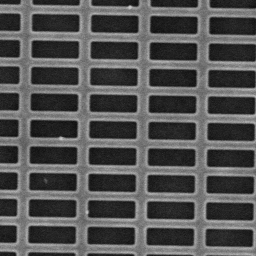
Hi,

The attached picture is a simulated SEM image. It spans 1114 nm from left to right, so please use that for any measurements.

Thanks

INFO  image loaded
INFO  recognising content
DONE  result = groups of lines, slits or small figures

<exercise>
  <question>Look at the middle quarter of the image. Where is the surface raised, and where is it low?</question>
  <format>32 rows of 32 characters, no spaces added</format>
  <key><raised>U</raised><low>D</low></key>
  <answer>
UUUUUUUUUUUUUUUUUUUUUUUUUUUUUUUU
DDDDUUDDDDDDDDDDDDUUUDDDDDDDDDDD
DDDDUUDDDDDDDDDDDDDUUDDDDDDDDDDD
DDDDUUDDDDDDDDDDDDDUUDDDDDDDDDDD
DDDDUUDDDDDDDDDDDDDUUDDDDDDDDDDD
UUDUUUUDDDDDDDDDDDUUUDDDDDDDDDDD
UUUUUUUUUUUUUUUUUUUUUUUUUUUUUUUU
DDDUUUUDDDDDDDDDDUUUUUUUUUUUUUUU
DDDDUUDDDDDDDDDDDDUUUDDDDDDDDDDD
DDDDUUDDDDDDDDDDDDUUUDDDDDDDDDDD
DDDDUUDDDDDDDDDDDDUUUDDDDDDDDDDD
DDDUUUDDDDDDDDDDDDUUUDDDDDDDDDDD
UUUUUUUUUUUUUUUUUUUUUUUUUUDDDDDD
UUUUUUUUUUUUUUUUUUUUUUUUUUUUUUUU
DDDUUUDDDDDDDDDDDDUUUUDDDDUUUUUU
DDDDUUDDDDDDDDDDDDUUUDDDDDDDDDDD
DDDDUUDDDDDDDDDDDDUUUDDDDDDDDDDD
DDDDUUDDDDDDDDDDDDUUUDDDDDDDDDDD
DDDUUUUDDDDDDDDDDDUUUDDDDDDDDDDD
UUUUUUUUUUUUUUUUUUUUUUUUUUUUUUUU
UUUUUUUUUUUUUUUUUUUUUUUUUUUUUUUU
DDDUUUDDDDDDDDDDDDUUUDDDDDDDDDDD
DDDDUUDDDDDDDDDDDDUUUDDDDDDDDDDD
DDDUUUDDDDDDDDDDDDUUUDDDDDDDDDDD
DDDUUUDDDDDDDDDDDDUUUDDDDDDDDDDD
UUUUUUUUUUUUUUUUUUUUUUDDDDDDDDDD
UUUUUUUUUUUUUUUUUUUUUUUUUUUUUUUU
DDDUUUDDDDDDDDDDDUUUUUUUUUUUUUUU
DDDUUUDDDDDDDDDDDDUUUDDDDDDDDDDD
DDDUUUDDDDDDDDDDDDUUUDDDDDDDDDDD
DDDUUUDDDDDDDDDDDDUUUDDDDDDDDDDD
DDDUUUDDDDDDDDDDDDUUUDDDDDDDDDDD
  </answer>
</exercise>